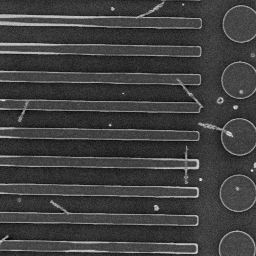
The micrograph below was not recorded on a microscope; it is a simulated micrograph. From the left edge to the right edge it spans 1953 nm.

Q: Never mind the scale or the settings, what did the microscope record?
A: groups of lines, slits or small figures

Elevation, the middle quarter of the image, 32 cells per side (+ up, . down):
................................
................................
++++++++++++++++++++++..........
++++++++++++++++++++++++++++++++
++++++++++++++++++++++++++++++++
................................
................................
................................
................................
++++++++........................
++++++++++++++++++++++++++++++++
.....+++++++++++++++++++++++++++
................................
................................
................................
................................
+++++++++++++++++++++...........
++++++++++++++++++++++++++++++++
++++++++++++++++++++++++++++++++
................................
................................
................................
................................
++++++++++++++..................
++++++++++++++++++++++++++++++++
++++++++++++++++++++++++++++++++
................................
................................
................................
................................
+++++++.........................
++++++++++++++++++++++++++++++++